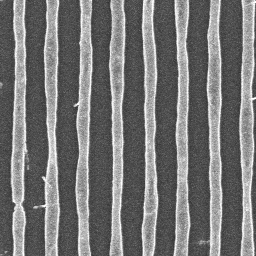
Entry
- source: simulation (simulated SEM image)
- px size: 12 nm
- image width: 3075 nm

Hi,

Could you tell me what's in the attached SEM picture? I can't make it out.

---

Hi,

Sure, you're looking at parallel lines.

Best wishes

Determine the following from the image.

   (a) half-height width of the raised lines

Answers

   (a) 126 nanometers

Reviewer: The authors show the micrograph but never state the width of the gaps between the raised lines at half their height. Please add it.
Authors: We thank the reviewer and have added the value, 0.266 microns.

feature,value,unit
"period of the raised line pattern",391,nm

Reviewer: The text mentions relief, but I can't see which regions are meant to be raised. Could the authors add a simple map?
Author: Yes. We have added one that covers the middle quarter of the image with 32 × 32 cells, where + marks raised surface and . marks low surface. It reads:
....+++.....+++.....+++......++.
....+++.....+++.....+++......++.
....+++.....+++.....+++......++.
....+++.....+++.....+++......++.
....+++.....+++.....+++......++.
....+++.....+++.....+++......++.
....+++.....+++.....+++......++.
....+++.....+++......++......++.
....++......++......+++......++.
....++......++......+++......++.
....++......++......+++......++.
....++......++......+++......++.
...+++......++......+++......++.
...+++......++......+++......++.
...+++......++......+++.....+++.
...+++......++......+++.....+++.
...+++......++.......++.....++..
....++......+++......++.....+++.
....++......+++......++.....+++.
....++......+++......+......+++.
....++......+++......++.....+++.
....++......+++......++......++.
....++......++.......++......++.
....++......++.......++......++.
....++......+++......+......+++.
....++......+++......++.....+++.
...+++......+++......++.....+++.
...+++......+++......++.....+++.
...+++......+++......++.....+++.
...+++......++.......++.....+++.
...+++......++.......++.....+++.
...+++......++......+++.....+++.